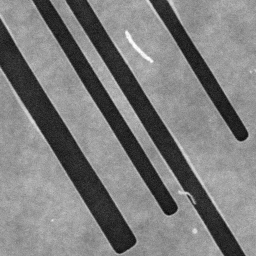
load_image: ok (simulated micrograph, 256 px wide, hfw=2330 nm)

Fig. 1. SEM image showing groups of lines, slits or small figures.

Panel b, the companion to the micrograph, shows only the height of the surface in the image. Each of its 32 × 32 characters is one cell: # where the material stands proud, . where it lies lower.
####...#...########..###########
#####..##...#######...##########
#####...##..########..##########
.#####..##...########..#########
.######..##...#######...########
..#####...##..########..########
...#####..##...########..#######
...######..##...#######..#######
....#####...#...########..######
#...######..##...########..#####
#....#####...##..########..#####
##....#####..##...########..####
##....######..##...#######...###
###....#####...##..########..###
####....#####..##...########..##
####....######..##...#######..##
#####....#####...#...########..#
######...######..##...########.#
######....#####...##...#########
#######....#####..##...#########
########...######..##...########
########....#####...#...########
#########....#####..##...#######
#########....#####...##...######
##########....#####..##...######
###########...######..##...#####
###########....#####..###..#####
############....#########...####
#############...##########...###
#############....#########...###
##############...##########...##
##############..############..##